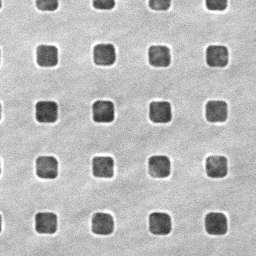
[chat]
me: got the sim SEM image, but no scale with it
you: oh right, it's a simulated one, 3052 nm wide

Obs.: a regular array of holes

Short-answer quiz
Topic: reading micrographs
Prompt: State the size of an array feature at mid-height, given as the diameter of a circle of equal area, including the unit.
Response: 0.302 µm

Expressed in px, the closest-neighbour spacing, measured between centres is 55.3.